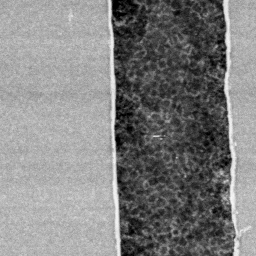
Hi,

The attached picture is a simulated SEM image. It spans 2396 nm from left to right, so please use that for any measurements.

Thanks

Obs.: one or a few lines or trenches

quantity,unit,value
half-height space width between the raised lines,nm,1100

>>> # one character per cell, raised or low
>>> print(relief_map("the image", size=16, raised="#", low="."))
#######.......##
#######.......##
#######.......##
#######.......##
#######.......##
#######.......##
#######.......##
#######.......##
#######.......##
#######........#
#######........#
#######........#
#######........#
#######........#
#######........#
#######........#